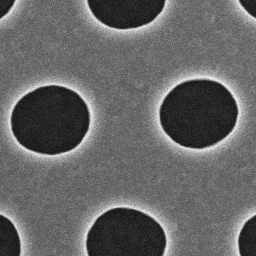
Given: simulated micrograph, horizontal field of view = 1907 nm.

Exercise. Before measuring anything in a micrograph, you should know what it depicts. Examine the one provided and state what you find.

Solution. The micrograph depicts holes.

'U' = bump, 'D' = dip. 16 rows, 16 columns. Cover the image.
DUUUUUDDDDUUUUUD
UUUUUUUDDUUUUUUU
UUUUUUUUUUUUUUUU
UUUUUUUUUUUUUUUU
UUUUUUUUUUUUUUUU
UUDDUUUUUUUDDDUU
UDDDDUUUUUDDDDDU
UDDDDDUUUUDDDDDU
UDDDDUUUUUUDDDUU
UUDDUUUUUUUUUUUU
UUUUUUUUUUUUUUUU
UUUUUUUUUUUUUUUU
UUUUUUUUUUUUUUUU
UUUUUUDDDUUUUUUU
DUUUUUDDDDUUUUUD
DUUUUDDDDDUUUUUD